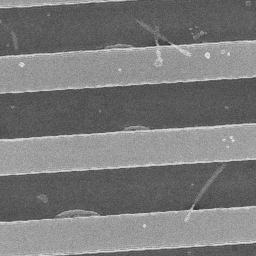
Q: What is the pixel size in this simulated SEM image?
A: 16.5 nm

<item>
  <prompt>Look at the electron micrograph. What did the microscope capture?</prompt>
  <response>lines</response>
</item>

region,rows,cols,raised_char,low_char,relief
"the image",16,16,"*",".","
................
................
................
****************
****************
******..........
................
................
...*************
****************
********........
................
................
......**********
****************
**********......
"